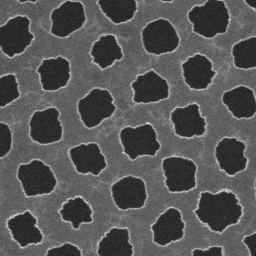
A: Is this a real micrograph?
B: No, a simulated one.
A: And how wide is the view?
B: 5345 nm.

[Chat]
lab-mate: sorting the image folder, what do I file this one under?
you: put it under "a regular array of raised bodies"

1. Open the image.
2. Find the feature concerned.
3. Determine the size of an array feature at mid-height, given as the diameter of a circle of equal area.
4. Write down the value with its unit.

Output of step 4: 0.733 um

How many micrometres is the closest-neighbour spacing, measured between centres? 1.09